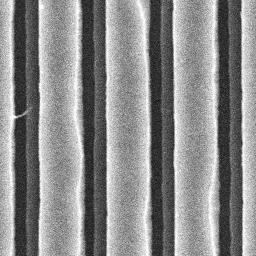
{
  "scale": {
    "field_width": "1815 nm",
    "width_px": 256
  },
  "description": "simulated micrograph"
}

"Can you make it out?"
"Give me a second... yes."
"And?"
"lines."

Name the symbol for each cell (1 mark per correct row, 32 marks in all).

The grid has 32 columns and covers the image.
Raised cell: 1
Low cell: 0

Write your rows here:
11000111110001111100001111100011
11000111110001111100001111100011
10000111110001111100001111100011
10000111110001111100001111100011
10000111110001111100001111100011
11000111110001111100001111100011
11000111110001111100001111100011
11000111110001111100001111100011
11000111110001111110001111100011
11000111110001111110001111100011
11000111110001111110001111100011
11000111110001111110001111100011
11000111110001111110001111100011
11000111110001111110001111100011
11000111110001111110001111100011
11000111110001111110001111100011
11000111110001111110001111100011
11000111110001111110001111100011
11000111110001111110001111100011
11000111110001111110001111100011
11000111110001111110001111100011
11000111110001111110001111100011
11000111110001111110001111100011
11000111110001111110001111100011
11000111110001111110001111100011
11000111110001111110001111100011
11000111110001111110001111100011
11000111110001111110001111100011
11000111110001111110001111100011
11000111110001111110001111100011
11000111110001111110001111100011
11000111110001111110001111100011